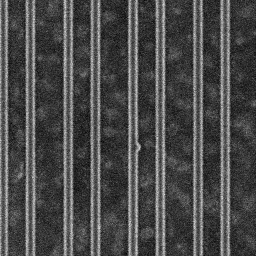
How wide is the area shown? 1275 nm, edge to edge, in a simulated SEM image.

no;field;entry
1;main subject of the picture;parallel lines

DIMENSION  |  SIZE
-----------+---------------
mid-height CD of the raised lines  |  43 nanometres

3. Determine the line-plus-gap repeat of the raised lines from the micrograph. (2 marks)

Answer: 162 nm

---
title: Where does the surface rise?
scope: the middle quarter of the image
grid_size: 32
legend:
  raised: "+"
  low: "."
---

++.....++.......++.....++.......
++.....++.......++.....++.......
++.....++.......++.....++.......
++.....++.......++.....++.......
++.....++.......++.....++.......
++.....++.......++.....++.......
++.....++.......++.....++.......
++.....++.......++.....++.......
++.....++.......++.....++.......
++.....++.......++.....++.......
++.....++.......++.....++.......
++.....++.......++.....++.......
++.....++.......++.....++.......
++.....++.......++.....++.......
++.....++.......++.....++.......
++.....++.......++.....++.......
++.....++.......++.....++.......
++.....++.......++.....++.......
++.....++.......++.....++.......
++.....++.......++.....++.......
++.....++.......+++....++.......
++.....++.......+++....++.......
++.....++.......++.....++.......
++.....++.......++.....++.......
++.....++.......++.....++.......
++.....++.......++.....++.......
++.....++.......++.....++.......
++.....++.......++.....++.......
++.....++.......++.....++.......
++.....++.......++.....++.......
++.....++.......++.....++.......
++.....++.......++.....++.......